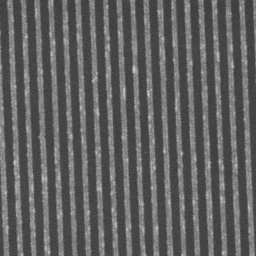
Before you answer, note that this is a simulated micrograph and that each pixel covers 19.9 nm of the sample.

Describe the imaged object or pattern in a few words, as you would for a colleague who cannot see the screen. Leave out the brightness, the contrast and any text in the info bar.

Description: parallel lines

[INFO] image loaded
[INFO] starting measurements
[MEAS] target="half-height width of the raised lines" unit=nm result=91.8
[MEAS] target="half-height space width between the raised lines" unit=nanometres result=181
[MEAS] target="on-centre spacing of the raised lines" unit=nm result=271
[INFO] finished